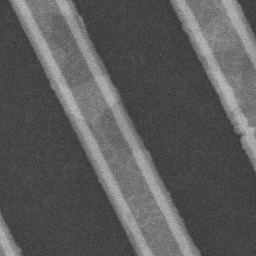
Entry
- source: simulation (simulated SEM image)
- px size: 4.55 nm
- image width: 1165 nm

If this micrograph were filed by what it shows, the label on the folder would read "one or a few lines or trenches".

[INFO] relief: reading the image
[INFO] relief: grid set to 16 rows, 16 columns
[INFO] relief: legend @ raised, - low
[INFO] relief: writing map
-@@@--------@@--
--@@@-------@@@-
---@@--------@@-
---@@@-------@@@
----@@--------@@
----@@@-------@@
----@@@--------@
-----@@@-------@
------@@--------
------@@@-------
-------@@-------
-------@@@------
--------@@------
--------@@@-----
---------@@-----
---------@@@----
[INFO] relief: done